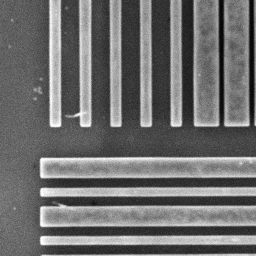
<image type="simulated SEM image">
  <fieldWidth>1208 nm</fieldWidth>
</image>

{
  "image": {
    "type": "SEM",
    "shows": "groups of lines, slits or small figures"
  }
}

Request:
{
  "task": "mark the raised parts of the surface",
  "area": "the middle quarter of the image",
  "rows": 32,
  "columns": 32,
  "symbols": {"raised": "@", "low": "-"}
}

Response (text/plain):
----@@------@@-----@@@-----@@---
----@@------@@-----@@@-----@@---
----@@------@@-----@@@-----@@---
----@@------@@-----@@@-----@@---
----@@------@@-----@@@-----@@---
----@@------@@-----@@@-----@@---
----@@------@@-----@@@-----@@---
----@@------@@-----@@@-----@@---
----@@------@@-----@@@-----@@---
----@@------@@-----@@@-----@@---
----@@------@@-----@@@-----@@---
----@@------@@-----@@@-----@@---
----@@------@@-----@@@-----@@---
----@@------@@-----@@@-----@@---
----@@------@@-----@@@-----@@---
--------------------------------
--------------------------------
--------------------------------
--------------------------------
--------------------------------
--------------------------------
--------------------------------
--------------------------------
--------------------------------
@@@@@@@@@@@@@@@@@@@@@@@@@@@@@@@@
@@@@@@@@@@@@@@@@@@@@@@@@@@@@@@@@
@@@@@@@@@@@@@@@@@@@@@@@@@@@@@@@@
@@@@@@@@@@@@@@@@@@@@@@@@@@@@@@@@
--------------------------------
--------------------------------
--------------------------------
@@@@@@@@@@@@@@@@@@@@@@@@@@@@@@@@